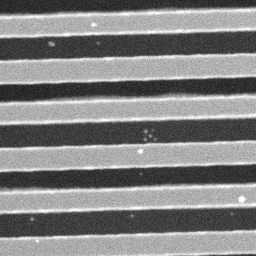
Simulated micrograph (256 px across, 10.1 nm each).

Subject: lines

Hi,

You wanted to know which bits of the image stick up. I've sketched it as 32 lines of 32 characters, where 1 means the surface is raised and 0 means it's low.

00000000000000000000000000000000
00000000000000000000011111111111
11111111111111111111111111111111
11111111111111111111111111111111
11111000000000000000000000000000
00000000000000000000000000000000
00000000000000000000000000000000
00000011111111111111111111111111
11111111111111111111111111111111
11111111111111111111111111111111
00000000000000000000000000000000
00000000000000000000000000000000
00000000000000111111111111111111
11111111111111111111111111111111
11111111111111111111111111111100
00000000000000000000000000000000
00000000000000000000000000000000
00000000000000000000000000000000
00011111111111111111111111111111
11111111111111111111111111111111
11111111111111111111111111111111
00000000000000000000000000000000
00000000000000000000000000000000
00000000000000000001111111111111
11111111111111111111111111111111
11111111111111111111111111111111
11100000000000000000000000000000
00000000000000000000000000000000
00000000000000000000000000000000
00000000001111111111111111111111
11111111111111111111111111111111
11111111111111111111111111111111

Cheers